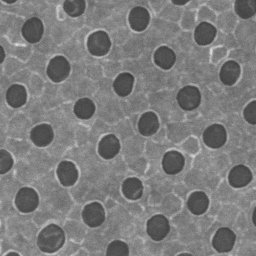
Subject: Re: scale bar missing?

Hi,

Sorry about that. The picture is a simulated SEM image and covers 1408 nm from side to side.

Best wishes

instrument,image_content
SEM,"a regular array of holes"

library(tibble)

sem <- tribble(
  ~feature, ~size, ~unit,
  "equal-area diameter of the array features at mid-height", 0.137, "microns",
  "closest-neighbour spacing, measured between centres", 254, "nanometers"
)